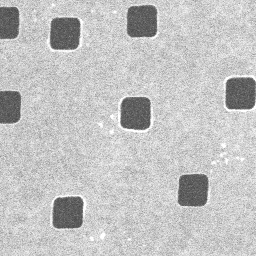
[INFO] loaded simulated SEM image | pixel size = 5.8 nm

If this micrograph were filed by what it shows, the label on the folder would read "holes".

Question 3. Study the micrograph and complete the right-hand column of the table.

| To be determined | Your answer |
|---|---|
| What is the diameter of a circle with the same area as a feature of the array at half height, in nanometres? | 200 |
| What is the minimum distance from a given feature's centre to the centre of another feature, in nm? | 535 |